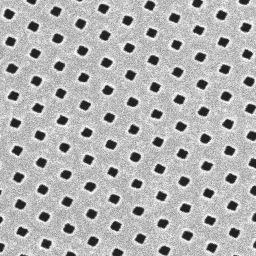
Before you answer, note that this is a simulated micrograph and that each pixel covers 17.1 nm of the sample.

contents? a regular array of holes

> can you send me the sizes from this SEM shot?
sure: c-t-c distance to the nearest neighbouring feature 460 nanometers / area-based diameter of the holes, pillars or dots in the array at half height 10.6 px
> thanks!